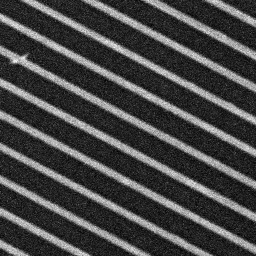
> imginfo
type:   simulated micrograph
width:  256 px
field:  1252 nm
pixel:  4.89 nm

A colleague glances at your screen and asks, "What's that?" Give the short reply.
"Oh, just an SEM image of parallel lines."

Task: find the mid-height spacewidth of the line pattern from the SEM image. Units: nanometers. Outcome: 113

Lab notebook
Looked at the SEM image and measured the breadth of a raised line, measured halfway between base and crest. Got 5.75 px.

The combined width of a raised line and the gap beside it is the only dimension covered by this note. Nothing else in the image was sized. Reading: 140 nm